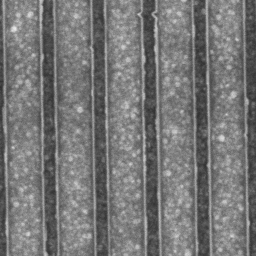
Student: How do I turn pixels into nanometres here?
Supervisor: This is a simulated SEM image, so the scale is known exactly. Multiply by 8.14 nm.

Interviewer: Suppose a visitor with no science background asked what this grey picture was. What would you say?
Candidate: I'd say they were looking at parallel lines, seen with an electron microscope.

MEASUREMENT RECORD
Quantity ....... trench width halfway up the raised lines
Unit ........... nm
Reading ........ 296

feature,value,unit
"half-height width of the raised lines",0.117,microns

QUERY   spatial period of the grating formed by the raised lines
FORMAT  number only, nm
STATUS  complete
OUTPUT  414